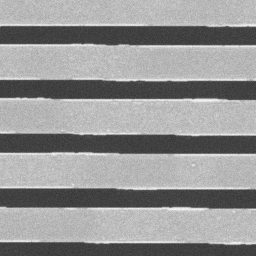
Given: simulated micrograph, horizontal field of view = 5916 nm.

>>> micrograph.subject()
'lines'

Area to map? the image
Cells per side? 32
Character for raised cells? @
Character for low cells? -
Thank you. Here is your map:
@@@@@@@@@@@@@@@@@@@@@@@@@@@@@@@@
@@@@@@@@@@@@@@@@@@@@@@@@@@@@@@@@
@@@@@@@@@@@@@@@@@@@@@@@@@@@@@@@@
--------------------------------
--------------------------------
--------------------------------
@@@@@@@@@@@@@@@@@@@@@@@@@@@@@@@@
@@@@@@@@@@@@@@@@@@@@@@@@@@@@@@@@
@@@@@@@@@@@@@@@@@@@@@@@@@@@@@@@@
@@@@@@@@@@@@@@@@@@@@@@@@@@@@@@@@
--------------------------------
--------------------------------
@@@@@@@@@@@@@@@@@@@@@@@---------
@@@@@@@@@@@@@@@@@@@@@@@@@@@@@@@@
@@@@@@@@@@@@@@@@@@@@@@@@@@@@@@@@
@@@@@@@@@@@@@@@@@@@@@@@@@@@@@@@@
@@@@@@@@@@@@@@@@@@@@@@@@@@@@@@@@
--------------------------------
--------------------------------
@@@@@@@@@@@@@@@@@@@@@@@@@@@@@@@@
@@@@@@@@@@@@@@@@@@@@@@@@@@@@@@@@
@@@@@@@@@@@@@@@@@@@@@@@@@@@@@@@@
@@@@@@@@@@@@@@@@@@@@@@@@@@@@@@@@
--------------------@@-@@@@@@@@@
--------------------------------
--------------------------------
@@@@@@@@@@@@@@@@@@@@@@@@@@@@@@@@
@@@@@@@@@@@@@@@@@@@@@@@@@@@@@@@@
@@@@@@@@@@@@@@@@@@@@@@@@@@@@@@@@
@@@@@@@@@@@@@@@@@@@@@@@@@@@@@@@@
--------------------------------
--------------------------------